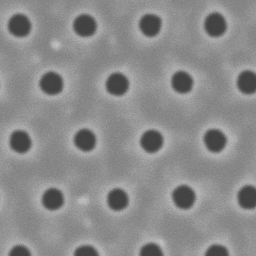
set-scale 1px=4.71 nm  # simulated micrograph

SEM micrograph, a regular array of holes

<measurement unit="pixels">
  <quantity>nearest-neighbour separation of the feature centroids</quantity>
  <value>64.7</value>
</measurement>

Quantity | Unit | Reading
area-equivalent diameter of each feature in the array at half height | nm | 110